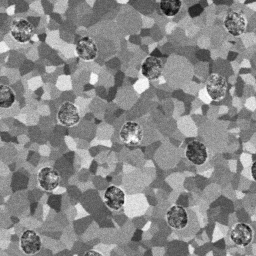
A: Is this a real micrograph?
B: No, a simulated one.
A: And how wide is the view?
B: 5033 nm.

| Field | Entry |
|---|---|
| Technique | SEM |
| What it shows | a regular array of holes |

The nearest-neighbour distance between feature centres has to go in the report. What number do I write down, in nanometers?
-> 1300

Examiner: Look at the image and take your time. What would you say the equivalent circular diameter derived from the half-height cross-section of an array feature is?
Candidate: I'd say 22.7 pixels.